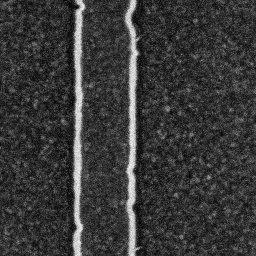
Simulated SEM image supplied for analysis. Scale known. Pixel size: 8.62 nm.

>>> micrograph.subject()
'one or a few lines or trenches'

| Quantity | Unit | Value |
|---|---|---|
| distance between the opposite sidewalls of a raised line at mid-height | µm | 0.483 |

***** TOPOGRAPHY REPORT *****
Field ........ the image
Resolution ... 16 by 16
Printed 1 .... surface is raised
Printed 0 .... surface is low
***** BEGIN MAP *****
0000011100000000
0000011100000000
0000011100000000
0000011100000000
0000011100000000
0000011100000000
0000011100000000
0000011100000000
0000011100000000
0000011100000000
0000011100000000
0000011100000000
0000011100000000
0000011100000000
0000011100000000
0000011100000000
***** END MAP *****